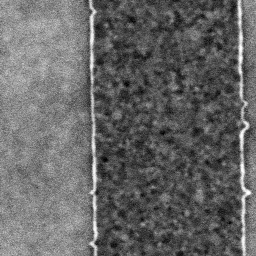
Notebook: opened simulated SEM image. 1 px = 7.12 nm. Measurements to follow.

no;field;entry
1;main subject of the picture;one or a few lines or trenches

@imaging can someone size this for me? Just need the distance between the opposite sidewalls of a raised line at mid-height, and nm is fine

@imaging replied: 1070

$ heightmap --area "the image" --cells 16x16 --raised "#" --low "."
......#########.
......#########.
......#########.
......#########.
......#########.
......#########.
......#########.
......#########.
......#########.
......#########.
......#########.
......#########.
......#########.
......#########.
......#########.
......#########.